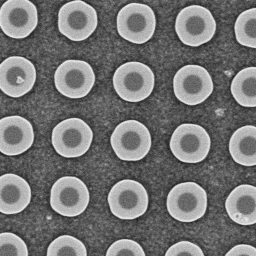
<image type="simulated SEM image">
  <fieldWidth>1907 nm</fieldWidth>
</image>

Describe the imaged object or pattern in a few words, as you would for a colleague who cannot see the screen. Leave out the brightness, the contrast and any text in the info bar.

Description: an array of small figures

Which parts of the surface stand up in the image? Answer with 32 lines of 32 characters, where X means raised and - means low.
-XXX----XXX-----XX--------------
XXXXX--XXXXX---XXXX----XXX----XX
XXXXX--XXXXX---XXXX---XXXXX---XX
XXXX---XXXXX---XXXX---XXXXX--XXX
-XX-----XXX----XXXX---XXXXX---XX
-----------------------XX-----XX
--------------------------------
-XX-----------------------------
XXXX---XXXX----XXXX----XX------X
XXXX---XXXXX--XXXXX---XXXX---XXX
XXXX---XXXXX--XXXXX---XXXXX--XXX
-XX----XXXX----XXXX---XXXX---XXX
----------------XX----XXXX----XX
--------------------------------
--------------------------------
XXXX---XXXX----XXX--------------
XXXX---XXXX---XXXXX---XXXX---XXX
XXXX---XXXX---XXXXX--XXXXX---XXX
XXXX---XXXX---XXXXX--XXXXX---XXX
--------XX-----XXX----XXXX---XXX
------------------------------XX
--------------------------------
XXX----XXX----------------------
XXXX---XXXX---XXXX----XXX----XXX
XXXX--XXXXX---XXXX---XXXXX---XXX
XXXX--XXXXX---XXXX---XXXXX--XXXX
XX-----XXX----XXXX---XXXXX--XXXX
----------------------XX-----XXX
--------------------------------
XX------X-----------------------
XXX---XXXX----XXX-----XX--------
XXX---XXXXX--XXXXX---XXXX----XXX